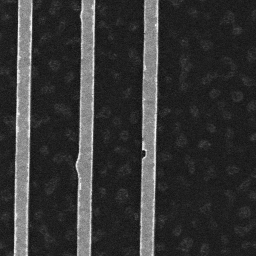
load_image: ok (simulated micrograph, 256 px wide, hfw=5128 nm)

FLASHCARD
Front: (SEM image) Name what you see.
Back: one or a few lines or trenches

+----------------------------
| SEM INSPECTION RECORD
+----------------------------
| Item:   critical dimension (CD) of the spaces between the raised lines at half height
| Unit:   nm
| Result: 996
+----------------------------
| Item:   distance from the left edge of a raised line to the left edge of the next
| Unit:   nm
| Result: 1260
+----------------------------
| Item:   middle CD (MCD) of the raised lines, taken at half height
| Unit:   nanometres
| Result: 258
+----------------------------